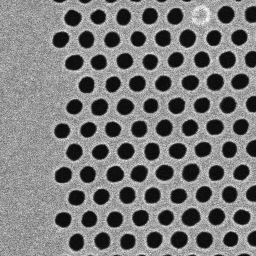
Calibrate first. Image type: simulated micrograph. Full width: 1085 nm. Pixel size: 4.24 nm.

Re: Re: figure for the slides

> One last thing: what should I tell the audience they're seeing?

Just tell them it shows a regular array of holes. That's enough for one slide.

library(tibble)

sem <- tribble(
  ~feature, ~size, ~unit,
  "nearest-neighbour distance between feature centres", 106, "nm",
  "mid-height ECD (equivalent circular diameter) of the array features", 66.4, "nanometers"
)